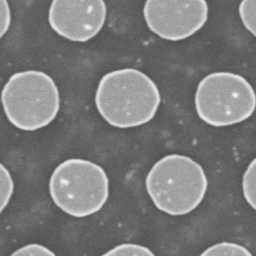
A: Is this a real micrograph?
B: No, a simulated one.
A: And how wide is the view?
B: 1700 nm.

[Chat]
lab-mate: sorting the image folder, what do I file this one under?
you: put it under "raised bodies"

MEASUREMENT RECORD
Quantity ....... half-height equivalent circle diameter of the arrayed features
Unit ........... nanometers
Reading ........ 375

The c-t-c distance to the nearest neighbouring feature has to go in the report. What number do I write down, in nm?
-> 647